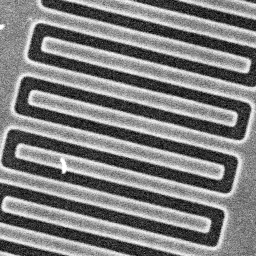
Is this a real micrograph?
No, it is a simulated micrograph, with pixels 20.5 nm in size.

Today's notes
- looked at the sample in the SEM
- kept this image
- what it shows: groups of lines, slits or small figures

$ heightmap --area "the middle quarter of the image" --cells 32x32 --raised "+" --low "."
.........++++++++++++++++.......
+.............+++++++++++++++...
+++++............+++++++++++++++
++++++++..............++++++++++
+++++++++++++.............++++++
.+++++++++++++++.............+++
......+++++++++++++++...........
.........++++++++++++++++.......
+.............+++++++++++++++...
++++.............+++++++++++++++
++++++++..............++++++++++
++++++++++++.............+++++++
++++++++++++++++.............+++
.....+++++++++++++++............
.........+++++++++++++++........
.............++++++++++++++++...
++++.............+++++++++++++++
+++++++++.............++++++++++
++++++++++++.............+++++++
.+++++++++++++++..............++
.....+++++++++++++++............
.........+++++++++++++++........
.............+++++++++++++++....
+++..............+++++++++++++++
++++++++.............+++++++++++
++++++++++++.............+++++++
+++++++++++++++..............+++
....+++++++++++++++.............
........+++++++++++++++.........
.............+++++++++++++++....
+++.............+++++++++++++++.
++++++++.............+++++++++++